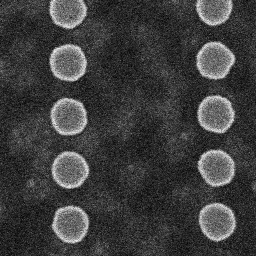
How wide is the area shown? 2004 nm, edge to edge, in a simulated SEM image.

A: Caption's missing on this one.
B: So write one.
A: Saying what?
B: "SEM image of a regular array of raised bodies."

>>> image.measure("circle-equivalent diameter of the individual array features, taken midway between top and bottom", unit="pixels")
35.9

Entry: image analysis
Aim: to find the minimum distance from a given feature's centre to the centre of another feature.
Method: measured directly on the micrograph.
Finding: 53.6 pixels